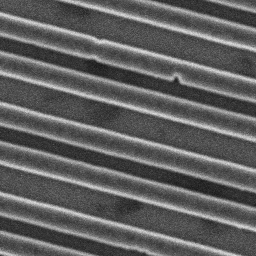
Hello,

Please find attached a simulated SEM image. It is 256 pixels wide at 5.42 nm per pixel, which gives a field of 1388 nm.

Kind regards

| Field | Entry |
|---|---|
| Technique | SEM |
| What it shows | parallel lines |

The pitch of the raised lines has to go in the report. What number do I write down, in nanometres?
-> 235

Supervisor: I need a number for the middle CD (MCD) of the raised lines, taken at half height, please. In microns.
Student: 0.113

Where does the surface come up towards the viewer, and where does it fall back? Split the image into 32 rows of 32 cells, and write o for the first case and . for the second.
..........oooooooooo........oooo
..............oooooooooo........
ooo...............ooooooooo.....
ooooooo..............oooooooooo.
.oooooooooo..............ooooooo
.....ooooooooo...............ooo
........oooooooooo..............
oooo........oooooooooo..........
ooooooo.........oooooooooo......
..ooooooooo........ooooooooooo..
.....oooooooooo........ooooooooo
.........oooooooooo........ooooo
.............oooooooooo........o
oo...............oooooooooo.....
oooooo..............ooooooooooo.
oooooooooo..............oooooooo
....oooooooooo..............oooo
.......oooooooooo..............o
ooo........oooooooooo...........
ooooooo........oooooooooo.......
ooooooooooo........oooooooooo...
....oooooooooo.........ooooooooo
........oooooooooo........oooooo
............oooooooooo........oo
o...............oooooooooo......
ooooo...............ooooooooo...
ooooooooo..............ooooooooo
...ooooooooo...............ooooo
.......oooooooooo..............o
oo........oooooooooo............
oooooo........oooooooooo........
oooooooooo........oooooooooo....